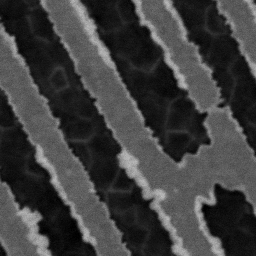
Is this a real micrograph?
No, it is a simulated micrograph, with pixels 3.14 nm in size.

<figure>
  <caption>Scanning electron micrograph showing one or a few lines or trenches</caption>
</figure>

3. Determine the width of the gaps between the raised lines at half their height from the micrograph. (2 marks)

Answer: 129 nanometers